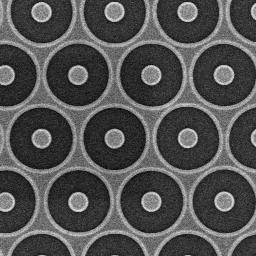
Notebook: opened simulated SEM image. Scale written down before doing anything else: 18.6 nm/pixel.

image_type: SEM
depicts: an array of small figures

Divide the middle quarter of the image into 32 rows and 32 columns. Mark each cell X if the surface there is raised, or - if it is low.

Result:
-----------XXX-------X--------XX
--XXX-------XX------XXXX------XX
-XXXXX------XX------XXXX------XX
-XXXXX------XX------XXXX------XX
--XXX------XXX------XXX-------XX
-----------XXX----------------XX
-----------XXXX--------------XXX
----------XXXXX--------------XXX
---------XXXXXXX------------XXXX
--------XXXXXXXXX----------XXXXX
X-----XXXXXXXXXXXXX------XXX----
XXXXXXXXX--------XXXXXXXXXX-----
XXXXXXX-----------XXXXXXX-------
-XXXXX-------------XXXXX--------
--XXXX--------------XXXX--------
--XXX---------------XXX---------
--XXX-------X--------XX-------XX
---XX------XXXX------XX------XXX
---X------XXXXX------XX------XXX
---XX-----XXXXX------XX------XXX
--XXX------XXX-------XX-------XX
--XXX---------------XXX---------
--XXX---------------XXXX--------
-XXXXX-------------XXXXX--------
XXXXXXX-----------XXXXXXX-------
XXXXXXXX---------XXXXXXXXX------
X-----XXXX-----XXXXX----XXXX----
--------XXXXXXXXX---------XXXXXX
---------XXXXXXX------------XXXX
----------XXXXX--------------XXX
-----------XXXX--------------XXX
-----------XXX----------------XX